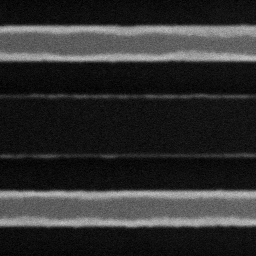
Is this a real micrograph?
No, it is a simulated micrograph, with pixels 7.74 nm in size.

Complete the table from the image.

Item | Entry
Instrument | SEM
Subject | lines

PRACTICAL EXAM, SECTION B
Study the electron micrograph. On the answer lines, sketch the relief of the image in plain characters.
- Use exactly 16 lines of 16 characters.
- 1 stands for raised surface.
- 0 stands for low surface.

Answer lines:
0000000000000000
0000000000000000
1111111111111111
1111111111100111
0000000000000000
0000000000000000
1111111111111111
1111111111111111
1111111111111111
1111111111111111
0000000000000000
0000000000000000
1111111111111111
1111111111111111
0000000000000000
0000000000000000